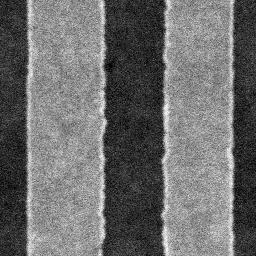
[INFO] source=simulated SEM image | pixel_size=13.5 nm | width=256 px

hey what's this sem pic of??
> one or a few lines or trenches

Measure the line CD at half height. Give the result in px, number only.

70.4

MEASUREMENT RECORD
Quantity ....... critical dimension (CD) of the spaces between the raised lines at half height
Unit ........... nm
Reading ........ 837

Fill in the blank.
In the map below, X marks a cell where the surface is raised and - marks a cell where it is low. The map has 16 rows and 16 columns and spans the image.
--XXXX----XXXXX-
--XXXX----XXXXX-
--XXXX----XXXX--
--XXXX----XXXX--
--XXXX----XXXX--
--XXXX----XXXX--
--XXXX----XXXX--
--XXXX----XXXX--
--XXXX----XXXX--
--XXXX----XXXX--
--XXXX----XXXX--
--XXXX----XXXX--
--XXXX----XXXX--
--XXXX----XXXX--
--XXXX----XXXX--
--XXXX----XXXX--